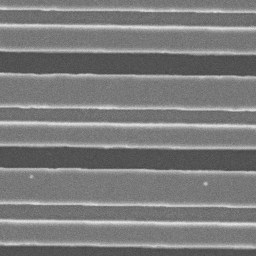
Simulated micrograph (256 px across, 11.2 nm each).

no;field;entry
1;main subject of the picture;lines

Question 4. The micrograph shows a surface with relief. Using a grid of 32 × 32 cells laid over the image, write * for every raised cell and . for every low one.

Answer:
********************************
********************************
********************************
********************************
********************************
********************************
...................*************
................................
................................
******************..............
********************************
********************************
********************************
********************************
********************************
********************************
********************************
********************************
.....................***********
................................
................................
********************************
********************************
********************************
********************************
********************************
********************************
********************************
********************************
********************************
********************************
................................